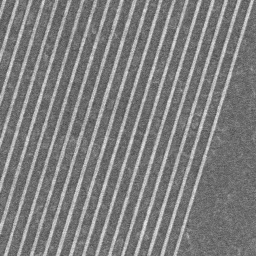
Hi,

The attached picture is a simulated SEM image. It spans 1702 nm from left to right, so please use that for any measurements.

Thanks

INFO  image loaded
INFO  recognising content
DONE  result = parallel lines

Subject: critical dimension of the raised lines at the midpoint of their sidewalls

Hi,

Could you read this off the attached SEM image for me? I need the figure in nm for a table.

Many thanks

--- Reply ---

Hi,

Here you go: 13.5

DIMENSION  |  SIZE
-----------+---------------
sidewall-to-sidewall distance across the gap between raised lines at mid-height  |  10.5 pixels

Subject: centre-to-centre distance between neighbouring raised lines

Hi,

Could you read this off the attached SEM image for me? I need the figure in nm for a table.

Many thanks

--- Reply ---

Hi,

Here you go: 83